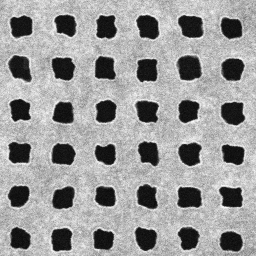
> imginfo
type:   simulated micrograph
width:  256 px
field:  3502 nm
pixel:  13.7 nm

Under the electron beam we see a regular array of holes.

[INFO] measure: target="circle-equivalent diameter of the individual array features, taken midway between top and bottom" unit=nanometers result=310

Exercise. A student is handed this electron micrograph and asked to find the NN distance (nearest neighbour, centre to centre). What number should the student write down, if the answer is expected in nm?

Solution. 563